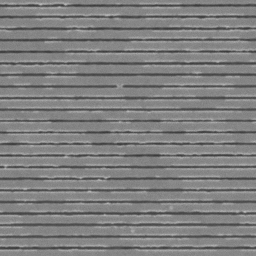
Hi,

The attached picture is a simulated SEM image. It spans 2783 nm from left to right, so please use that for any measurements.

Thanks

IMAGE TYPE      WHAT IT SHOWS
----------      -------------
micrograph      parallel lines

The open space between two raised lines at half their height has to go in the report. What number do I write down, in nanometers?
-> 28.5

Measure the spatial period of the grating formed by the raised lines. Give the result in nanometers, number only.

126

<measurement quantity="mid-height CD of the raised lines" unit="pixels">9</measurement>